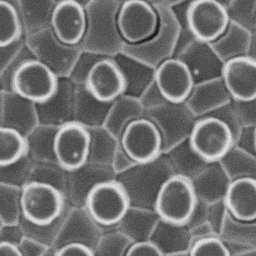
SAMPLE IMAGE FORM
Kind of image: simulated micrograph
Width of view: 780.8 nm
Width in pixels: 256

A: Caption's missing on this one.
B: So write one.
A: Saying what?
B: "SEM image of a regular array of raised bodies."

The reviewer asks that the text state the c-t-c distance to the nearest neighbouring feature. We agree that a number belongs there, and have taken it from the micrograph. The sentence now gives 197 nm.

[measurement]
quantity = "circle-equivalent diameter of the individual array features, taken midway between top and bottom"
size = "116 nm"